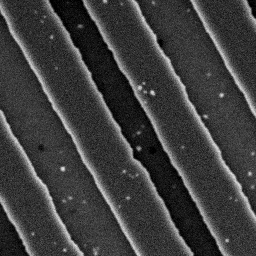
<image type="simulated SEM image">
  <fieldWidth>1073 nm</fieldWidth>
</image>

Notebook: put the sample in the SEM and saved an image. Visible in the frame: lines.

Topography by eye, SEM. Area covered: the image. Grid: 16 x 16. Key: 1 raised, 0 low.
1110011110001111
1111001110000111
0111000111000111
0011100111000011
0011110011100011
0001110011110001
0001111001110000
0000111001111000
1000111100111000
1100011100111100
1100011110011100
1110001111001110
1110000111001110
1111000111100111
0111000011100111
0011100011110011